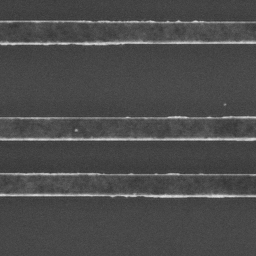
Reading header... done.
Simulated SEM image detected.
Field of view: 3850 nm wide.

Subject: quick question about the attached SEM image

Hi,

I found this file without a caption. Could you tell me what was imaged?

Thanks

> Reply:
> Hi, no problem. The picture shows lines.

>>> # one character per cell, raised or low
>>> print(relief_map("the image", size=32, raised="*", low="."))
................................
................................
................................
********************************
********************************
................................
................................
................................
................................
................................
................................
................................
................................
................................
................................
********************************
********************************
................................
................................
................................
................................
................................
********************************
********************************
..................**************
................................
................................
................................
................................
................................
................................
................................